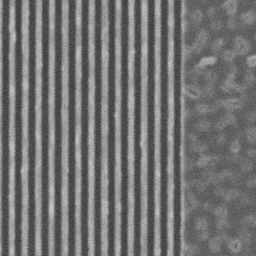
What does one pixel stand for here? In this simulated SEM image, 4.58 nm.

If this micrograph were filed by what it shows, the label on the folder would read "parallel lines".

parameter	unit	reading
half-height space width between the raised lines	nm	34.9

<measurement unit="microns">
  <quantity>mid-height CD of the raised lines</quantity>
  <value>0.0246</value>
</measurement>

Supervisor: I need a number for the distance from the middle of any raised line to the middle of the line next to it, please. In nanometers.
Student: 60.6